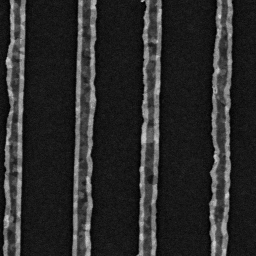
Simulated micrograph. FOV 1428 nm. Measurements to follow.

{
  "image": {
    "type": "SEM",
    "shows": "one or a few lines or trenches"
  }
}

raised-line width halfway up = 71.1 nm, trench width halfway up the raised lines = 57.1 pixels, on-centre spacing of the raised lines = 385 nm